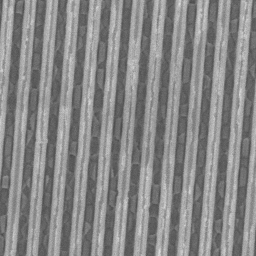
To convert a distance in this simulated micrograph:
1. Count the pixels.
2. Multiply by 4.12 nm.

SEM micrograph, parallel lines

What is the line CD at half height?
0.0364 µm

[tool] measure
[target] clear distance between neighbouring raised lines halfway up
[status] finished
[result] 12.5 px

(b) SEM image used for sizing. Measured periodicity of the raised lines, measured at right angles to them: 88.6 nm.